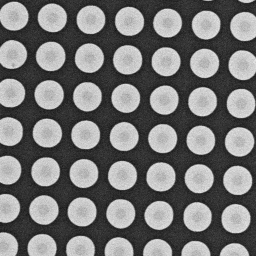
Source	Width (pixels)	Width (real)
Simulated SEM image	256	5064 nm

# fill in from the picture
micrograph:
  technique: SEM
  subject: an array of small figures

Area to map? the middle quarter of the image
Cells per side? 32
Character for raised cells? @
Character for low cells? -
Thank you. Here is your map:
---@@@@@@----@@@@@@---@@@@@@@---
----@@@@-----@@@@@@----@@@@@----
----------------@-------@@@-----
--------------------------------
--------------------------------
---@@@@@------@@@--------@------
---@@@@@@----@@@@@-----@@@@@----
--@@@@@@@---@@@@@@@---@@@@@@----
--@@@@@@@---@@@@@@@---@@@@@@---@
---@@@@@@---@@@@@@@---@@@@@@---@
---@@@@@@----@@@@@----@@@@@@---@
-----@@-------@@@@-----@@@@@----
------------------------@@------
--------------------------------
----@@@-------------------------
---@@@@@-----@@@@------@@@------
--@@@@@@@---@@@@@@----@@@@@@----
--@@@@@@@---@@@@@@---@@@@@@@---@
--@@@@@@@---@@@@@@@--@@@@@@@---@
--@@@@@@@---@@@@@@---@@@@@@@---@
---@@@@@----@@@@@@----@@@@@@---@
--------------@@------@@@@@-----
--------------------------------
--------------------------------
---@@@@------@@@----------------
--@@@@@@----@@@@@-----@@@@@-----
--@@@@@@---@@@@@@@---@@@@@@----@
--@@@@@@---@@@@@@@---@@@@@@@--@@
--@@@@@@---@@@@@@@---@@@@@@@--@@
--@@@@@@---@@@@@@@---@@@@@@@--@@
---@@@@-----@@@@@----@@@@@@----@
-----------------------@@@------